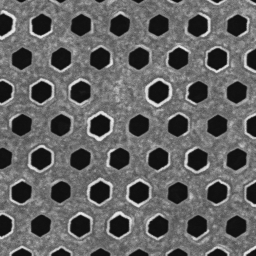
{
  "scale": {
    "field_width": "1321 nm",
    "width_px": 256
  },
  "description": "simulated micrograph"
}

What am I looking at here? a regular array of holes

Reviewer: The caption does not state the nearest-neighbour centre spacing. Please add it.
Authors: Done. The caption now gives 199 nanometers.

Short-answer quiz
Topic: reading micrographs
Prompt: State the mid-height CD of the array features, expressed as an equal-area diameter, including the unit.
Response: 107 nm